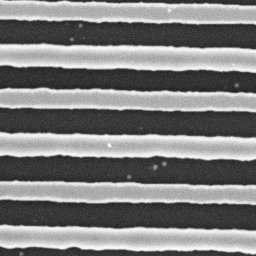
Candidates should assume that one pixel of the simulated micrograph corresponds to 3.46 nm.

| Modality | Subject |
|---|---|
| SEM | lines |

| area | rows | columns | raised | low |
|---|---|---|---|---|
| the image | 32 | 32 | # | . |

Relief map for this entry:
#####################....#......
################################
......##..######################
................................
................................
................................
################################
################################
..........#####.################
................................
................................
######################..........
################################
.............###################
................................
................................
................................
################################
################################
.######..##########.############
................................
................................
................................
################################
################################
...............................#
................................
................................
#############....#..............
################################
################################
..............................##